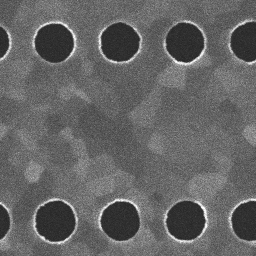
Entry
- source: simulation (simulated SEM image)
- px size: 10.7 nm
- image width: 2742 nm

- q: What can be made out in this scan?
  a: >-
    holes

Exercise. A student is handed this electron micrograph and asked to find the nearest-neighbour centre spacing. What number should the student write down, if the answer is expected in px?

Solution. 65.1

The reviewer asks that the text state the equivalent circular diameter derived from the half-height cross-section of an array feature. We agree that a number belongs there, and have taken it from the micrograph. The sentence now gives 0.425 µm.